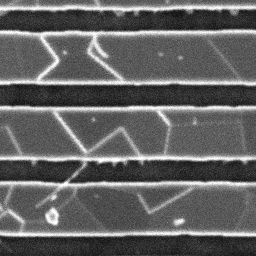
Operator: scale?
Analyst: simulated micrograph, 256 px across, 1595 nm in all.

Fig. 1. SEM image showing lines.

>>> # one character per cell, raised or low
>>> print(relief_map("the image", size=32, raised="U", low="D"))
UUUUUUUUUUUUUUUUUUUUUUUUUUUUUUUU
DDDDDDDDDDDDDDDDDDDDDDDDDDDDDDDD
DDDDDDDDDDDDDDDDDDDDDDDDDDDDDDDD
DDDDDDDDDDDDDDDDDDDDDDDDDDDDDDDD
UUUUUUUUUUUUUUUUUUUUUUUUUUUUUUUU
UUUUUUUUUUUUUUUUUUUUUUUUUUUUUUUU
UUUUUUUUUUUUUUUUUUUUUUUUUUUUUUUU
UUUUUUUUUUUUUUUUUUUUUUUUUUUUUUUU
UUUUUUUUUUUUUUUUUUUUUUUUUUUUUUUU
UUUUUUUUUUUUUUUUUUUUUUUUUUUUUUUU
DDDDDDDDDDDDDDDDDDDDDDDDDDDDDDDU
DDDDDDDDDDDDDDDDDDDDDDDDDDDDDDDD
DDDDDDDDDDDDDDDDDDDDDDDDDDDDDDDD
UUUUUUUUUUUUUUUUUUUUUUUUUUUUUUUU
UUUUUUUUUUUUUUUUUUUUUUUUUUUUUUUU
UUUUUUUUUUUUUUUUUUUUUUUUUUUUUUUU
UUUUUUUUUUUUUUUUUUUUUUUUUUUUUUUU
UUUUUUUUUUUUUUUUUUUUUUUUUUUUUUUU
UUUUUUUUUUUUUUUUUUUUUUUUUUUUUUUU
UUUUUUUUUUUUUUUUUUUUUUUUUUUUUUUU
DDDDDDDDDDDDDDDDDDDDDDDDDDDDDDDD
DDDDDDDDDDDDDDDDDDDDDDDDDDDDDDDD
DDDDDDDDDDDDDDDDDDDDDDDDDDDDDDDD
UUUUUUUUUUUUUUUUUUUUUUUUUUUUUUUU
UUUUUUUUUUUUUUUUUUUUUUUUUUUUUUUU
UUUUUUUUUUUUUUUUUUUUUUUUUUUUUUUU
UUUUUUUUUUUUUUUUUUUUUUUUUUUUUUUU
UUUUUUUUUUUUUUUUUUUUUUUUUUUUUUUU
UUUUUUUUUUUUUUUUUUUUUUUUUUUUUUUU
DDDDDDDDDDDDDDDDDDDDDDDDDDDDDDDD
DDDDDDDDDDDDDDDDDDDDDDDDDDDDDDDD
DDDDDDDDDDDDDDDDDDDDDDDDDDDDDDDD